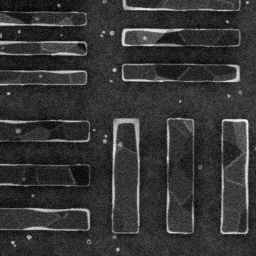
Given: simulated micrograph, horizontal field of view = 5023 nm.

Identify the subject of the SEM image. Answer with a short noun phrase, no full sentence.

groups of lines, slits or small figures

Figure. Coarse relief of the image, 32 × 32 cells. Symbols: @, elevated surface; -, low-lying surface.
----------------@@@@@@@@@@@@@@--
@@--@@@-------------------------
@@@@@@@@@@@---------------------
--------------------------------
---------------@@@@@@@@@@@@@@@--
@@@@@@@@@@@-----@@@@@@@@@@@@@@--
@@@@@@@@@@@---------------------
--------------------------------
---------------@@@@@@@@@@@@@@@--
@@@@@@@@@@@----@@@@@@@@@@@@@@@--
@@@@@@@@@@----------------------
--------------------------------
--------------------------------
--------------------------------
--------------------------------
@@@@@@@@@@@----@@----@@@----@@@-
@@@@@@@@@@@---@@@----@@@----@@@-
@@@@@@@@@@@---@@@----@@@----@@@-
--------------@@@----@@@----@@@-
--------------@@@----@@@----@@@-
--------------@@@----@@@----@@@-
@@@@@@@@@@@---@@@----@@@----@@@-
@@@@@@@@@@@---@@@----@@@----@@@-
--------------@@@----@@@----@@@-
--------------@@@----@@@----@@@-
--------------@@@----@@@----@@@-
@@@@@@@@@@@---@@@----@@@----@@@-
@@@@@@@@@@@---@@@----@@@----@@@-
@@@@-@@@@@@---@@@----@@@----@@@-
--------------------------------
--------------------------------
--------------------------------